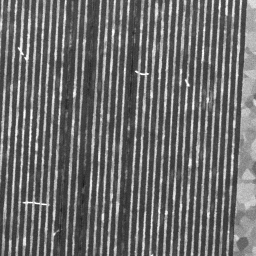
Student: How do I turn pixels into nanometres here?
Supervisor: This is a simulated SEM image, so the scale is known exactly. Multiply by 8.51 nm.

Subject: parallel lines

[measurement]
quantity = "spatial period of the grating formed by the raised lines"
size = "59.7 nm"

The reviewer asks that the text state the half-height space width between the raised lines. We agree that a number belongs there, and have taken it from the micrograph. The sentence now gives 45.7 nanometers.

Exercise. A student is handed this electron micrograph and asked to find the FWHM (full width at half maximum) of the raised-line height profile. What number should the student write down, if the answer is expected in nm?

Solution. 12.7